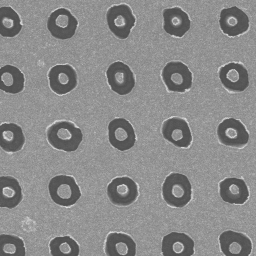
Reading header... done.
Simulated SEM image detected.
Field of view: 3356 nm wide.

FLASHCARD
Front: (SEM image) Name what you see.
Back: a regular array of ring-shaped grooves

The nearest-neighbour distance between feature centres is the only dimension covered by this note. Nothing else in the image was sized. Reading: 722 nm